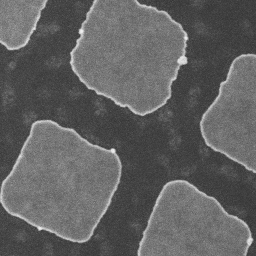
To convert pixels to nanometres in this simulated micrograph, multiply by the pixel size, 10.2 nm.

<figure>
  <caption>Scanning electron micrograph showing raised bodies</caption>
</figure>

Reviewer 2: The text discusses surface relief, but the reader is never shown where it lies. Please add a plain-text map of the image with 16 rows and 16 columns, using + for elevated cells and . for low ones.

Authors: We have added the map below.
+++...++++......
++...++++++.....
++...+++++++....
....++++++++...+
.....++++++...++
......+++++...++
.......+++...+++
.............+++
..+++........+++
.++++++.......++
.+++++++.......+
+++++++....+....
+++++++...+++...
.+++++...++++++.
...+++...+++++++
.........+++++++